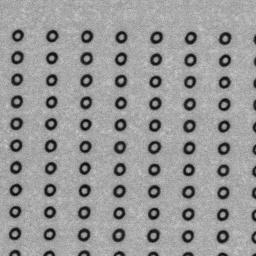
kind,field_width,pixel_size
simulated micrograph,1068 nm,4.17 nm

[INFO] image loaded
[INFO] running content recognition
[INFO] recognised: a regular array of ring-shaped grooves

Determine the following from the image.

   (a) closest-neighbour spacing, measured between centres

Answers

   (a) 90.6 nm